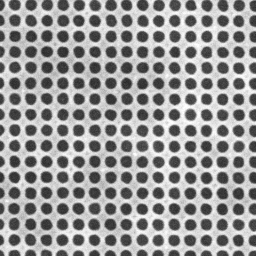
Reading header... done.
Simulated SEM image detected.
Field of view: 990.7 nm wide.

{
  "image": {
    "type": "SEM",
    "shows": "a regular array of holes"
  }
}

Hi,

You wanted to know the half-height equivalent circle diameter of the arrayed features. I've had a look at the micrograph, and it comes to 46 nm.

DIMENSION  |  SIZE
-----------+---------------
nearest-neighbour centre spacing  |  60 nanometers